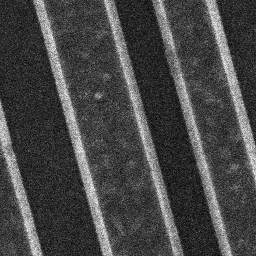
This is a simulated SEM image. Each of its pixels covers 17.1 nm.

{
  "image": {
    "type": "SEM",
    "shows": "one or a few lines or trenches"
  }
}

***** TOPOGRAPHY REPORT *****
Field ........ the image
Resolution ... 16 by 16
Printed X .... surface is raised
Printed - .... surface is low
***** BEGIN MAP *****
---XXXX---XXX---
---XXXX---XXXX--
---XXXX---XXXX--
---XXXXX---XXX--
----XXXX---XXX--
----XXXX---XXXX-
----XXXXX---XXX-
----XXXXX---XXX-
-----XXXX---XXX-
X----XXXX---XXXX
X----XXXXX---XXX
X----XXXXX---XXX
X-----XXXX---XXX
XX----XXXX---XXX
XX----XXXXX---XX
XX-----XXXX---XX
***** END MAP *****